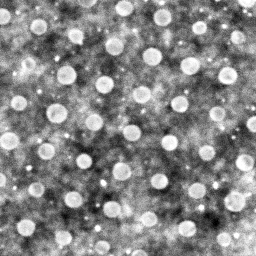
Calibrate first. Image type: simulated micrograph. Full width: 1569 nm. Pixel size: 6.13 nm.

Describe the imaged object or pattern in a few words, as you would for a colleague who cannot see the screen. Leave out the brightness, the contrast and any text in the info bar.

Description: a regular array of raised bodies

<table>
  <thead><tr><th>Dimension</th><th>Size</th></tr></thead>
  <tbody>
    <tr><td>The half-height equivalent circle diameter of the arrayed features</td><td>0.0936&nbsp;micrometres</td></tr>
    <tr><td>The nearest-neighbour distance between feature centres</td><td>0.237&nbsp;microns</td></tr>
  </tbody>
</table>